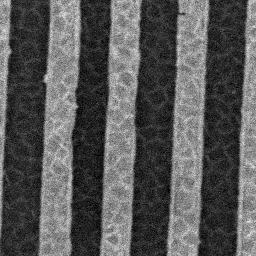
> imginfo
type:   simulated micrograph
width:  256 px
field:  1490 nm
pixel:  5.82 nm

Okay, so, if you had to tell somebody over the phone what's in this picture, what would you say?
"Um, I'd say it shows one or a few lines or trenches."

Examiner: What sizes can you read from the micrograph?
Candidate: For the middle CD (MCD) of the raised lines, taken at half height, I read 0.155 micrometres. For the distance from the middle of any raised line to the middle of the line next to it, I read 374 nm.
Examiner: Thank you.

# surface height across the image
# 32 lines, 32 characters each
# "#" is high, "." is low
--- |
#......###....###......###.....#
#......###....###......###.....#
#.....####....###.....####.....#
#.....####....###.....####.....#
#.....####....###.....####.....#
#.....####....###.....####.....#
#.....####....###.....###......#
#.....####....###.....####.....#
#.....###.....###.....####.....#
#.....###.....###.....###......#
#.....###.....###.....###......#
#.....###.....###.....###......#
#.....###.....###.....###......#
#.....####....###.....###.....##
#.....###.....###.....###.....##
......###....####.....###.....##
......###....####.....###.....##
......###....####.....###.....##
......###....####.....###.....##
......###....####.....###.....##
......###....####.....###.....##
......###....####.....###.....##
......###....####.....###.....##
.....####....###......###.....##
.....####....###......###.....##
.....####....###......###.....##
.....####....###.....####.....##
.....####....###.....####.....##
.....###.....###.....####.....##
.....###.....###.....####.....##
.....###.....###.....####.....##
.....###.....###.....###......##